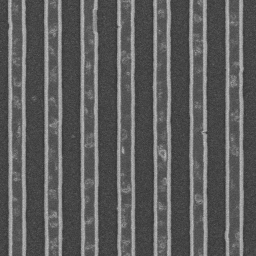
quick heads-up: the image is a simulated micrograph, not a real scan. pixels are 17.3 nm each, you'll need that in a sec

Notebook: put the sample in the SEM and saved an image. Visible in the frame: parallel lines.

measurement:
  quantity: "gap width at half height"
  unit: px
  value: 21.3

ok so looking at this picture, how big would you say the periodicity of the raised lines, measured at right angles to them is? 36.2 px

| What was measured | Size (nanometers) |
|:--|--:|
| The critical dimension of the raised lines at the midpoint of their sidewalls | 259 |